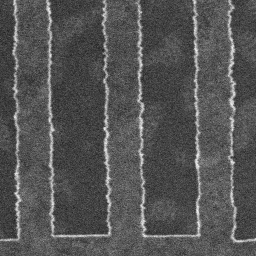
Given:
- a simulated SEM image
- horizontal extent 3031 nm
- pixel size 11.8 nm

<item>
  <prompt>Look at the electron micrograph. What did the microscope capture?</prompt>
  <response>one or a few lines or trenches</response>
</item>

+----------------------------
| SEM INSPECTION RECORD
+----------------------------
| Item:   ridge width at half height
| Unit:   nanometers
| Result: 414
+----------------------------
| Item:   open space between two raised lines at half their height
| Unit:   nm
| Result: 654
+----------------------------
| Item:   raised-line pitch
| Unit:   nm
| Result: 1070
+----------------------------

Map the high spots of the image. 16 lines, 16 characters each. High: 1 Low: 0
0110000110001100
0110001110001100
0110000110001100
0110000110001110
0110000110001100
0110000110001110
0110000110001110
0110000110001110
0110000110001110
0110000110001100
0110000110001110
0110000110001110
0110000110001110
0110000110001110
0111000110001110
1111111111111111